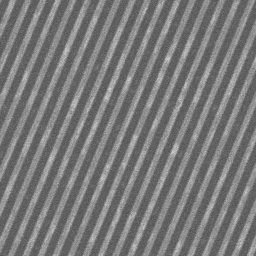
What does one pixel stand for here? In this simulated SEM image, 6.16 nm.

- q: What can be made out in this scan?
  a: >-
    parallel lines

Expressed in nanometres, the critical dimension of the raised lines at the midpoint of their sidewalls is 33.4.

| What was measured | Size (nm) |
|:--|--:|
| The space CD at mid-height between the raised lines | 56.2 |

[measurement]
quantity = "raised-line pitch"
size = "84.9 nm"